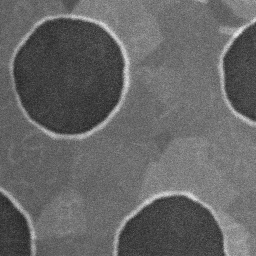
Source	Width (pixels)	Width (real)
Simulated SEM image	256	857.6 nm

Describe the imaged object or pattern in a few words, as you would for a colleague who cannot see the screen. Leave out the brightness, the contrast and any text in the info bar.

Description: holes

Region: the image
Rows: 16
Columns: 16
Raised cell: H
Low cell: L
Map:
HHHHHHHHHHHHHHHH
HHLLLLHHHHHHHHHH
HHLLLLLHHHHHHHHL
HLLLLLLLHHHHHHLL
HLLLLLLLHHHHHHLL
HLLLLLLLHHHHHHLL
HLLLLLLHHHHHHHLL
HHLLLLLHHHHHHHHH
HHHHLHHHHHHHHHHH
HHHHHHHHHHHHHHHH
HHHHHHHHHHHHHHHH
HHHHHHHHHHHHHHHH
LHHHHHHHHHLLHHHH
LLHHHHHHLLLLLHHH
LLHHHHHHLLLLLLHH
LLHHHHHLLLLLLLHH